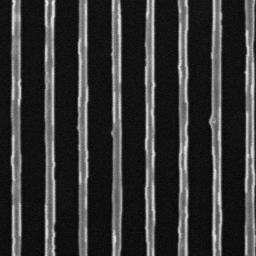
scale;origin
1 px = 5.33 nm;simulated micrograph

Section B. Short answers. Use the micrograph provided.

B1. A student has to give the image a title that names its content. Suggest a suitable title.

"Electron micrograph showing parallel lines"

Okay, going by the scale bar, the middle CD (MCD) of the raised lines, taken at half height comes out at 48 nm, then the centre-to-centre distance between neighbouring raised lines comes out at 178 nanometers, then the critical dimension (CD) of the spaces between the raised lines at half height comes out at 133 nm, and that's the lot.